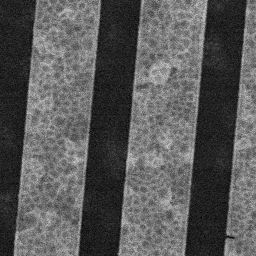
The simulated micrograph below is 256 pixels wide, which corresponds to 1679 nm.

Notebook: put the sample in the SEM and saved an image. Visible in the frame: one or a few lines or trenches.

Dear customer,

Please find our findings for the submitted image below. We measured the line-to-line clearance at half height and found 277 nm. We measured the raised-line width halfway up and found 408 nanometers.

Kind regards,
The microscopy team